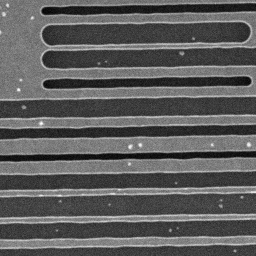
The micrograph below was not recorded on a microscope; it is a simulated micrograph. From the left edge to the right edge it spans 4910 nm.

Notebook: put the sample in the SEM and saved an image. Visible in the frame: groups of lines, slits or small figures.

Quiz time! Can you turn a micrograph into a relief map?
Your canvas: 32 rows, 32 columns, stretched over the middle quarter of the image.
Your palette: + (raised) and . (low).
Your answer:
................................
++++++++++++++++++++++++++++++++
++++++++++++++++++++++++++++++++
.+++++++++++....................
................................
................................
++++++++++++++++++++++++++++++++
++++++++++++++++++++++++++++++++
+++++++++++++...................
................................
................................
................................
................................
............++++++++++++++++++++
++++++++++++++++++++++++++++++++
++++++++++++++++................
................................
................................
....++..++++++++++++++++++++++++
++++++++++++++++++++++++++++++++
++++++++++++++++++++++++++++++++
++++++++++++++++++++++++++++++++
................................
................................
++++++++++++++++++++++++++++++++
++++++++++++++++++++++++++++++++
++++++++++++++++++++++++++++++++
................................
................................
................................
................................
++++++++++++++++++++++++++++++++